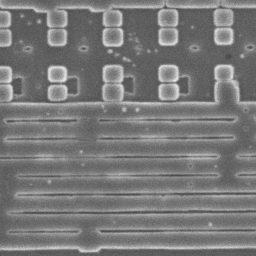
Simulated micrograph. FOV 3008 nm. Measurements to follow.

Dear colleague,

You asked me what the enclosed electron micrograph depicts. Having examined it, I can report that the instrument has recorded wiring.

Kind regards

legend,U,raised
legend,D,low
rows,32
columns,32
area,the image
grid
UUUUUUUUUUUUUUUUUUUUUUUUUUUUUUUU
UDDDDUUUDDDDDUUDDDDDUUDDDDDUUDDD
UDDDDDUUDDDDDUUDDDDDUUDDDDDUUDDD
UDDDDDUUDDDDDUUDDDDDUUDDDDDUUDDD
UDDDDDUUDDDDDUUDDDDDUUDDDDDUUDDD
UDDDDDUUDDDDDUUDDDDDDDDDDDDDDDDD
DDDDDDDDDDDDDDDDDDDDDDDDDDDDDDDD
DDDDDDDDDDDDDDDDDDDDDDDDDDDDDDDD
UDDDDDUUDDDDDUUDDDDDUUDDDDDUUDDD
UDDDDDUUDDDDDUUDDDDDUUDDDDDUUDDD
UDDDDDDUDDDDDUUDDDDDUUDDDDDUUDDD
UDDDDDUUDDDDDUUDDDDDUUDDDDDUUUDD
UDDDDDUUDDDDDUUDDDDDUUDDDDDUUUDD
UUUUUUUUUUUUUUUUUUUUUUUUUUUUUUUU
UUUUUUUUUUUUUUUUUUUUUUUUUUUUUUUU
UUUUUUUUUUUUUUUUUUUUUUUUUUUUUUUU
UUUUUUUUUUUUUUUUUUUUUUUUUUUUUUUU
UUUUUUUUUUUUUUUUUUUUUUUUUUUUUUUU
UUUUUUUUUUUUUUUUUUUUUUUUUUUUUUUU
UUUUUUUUUUUUUUUUUUUUUUUUUUUUUUUU
UUUUUUUUUUUUUUUUUUUUUUUUUUUUUUUU
UUUUUUUUUUUUUUUUUUUUUUUUUUUUUUUU
UUUUUUUUUUUUUUUUUUUUUUUUUUUUUUUU
UUUUUUUUUUUUUUUUUUUUUUUUUUUUUUUU
UUUUUUUUUUUUUUUUUUUUUUUUUUUUUUUU
UUUUUUUUUUUUUUUUUUUUUUUUUUUUUUUU
UUUUUUUUUUUUUUUUUUUUUUUUDDUUUUUU
UUUUUUUUUUUUUUUUUUUUUUUUUUUUUUUU
UUUUUUUUUUUUUUUUUUUUUUUUUUUUUUUU
UUUUUUUUUUUUUUUUUUUUUUUUUUUUUUUU
UUUUUUUUUUUUUUUUUUUUUUUUUUUUUUUU
DDDDDDDDDDDDDDDDDDDDDDDDDDDDDDDD